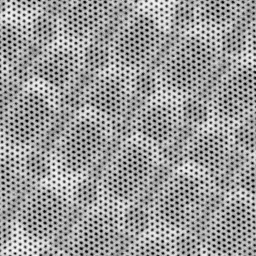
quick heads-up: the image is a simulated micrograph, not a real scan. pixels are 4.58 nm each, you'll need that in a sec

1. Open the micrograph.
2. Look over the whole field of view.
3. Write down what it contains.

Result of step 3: a regular array of holes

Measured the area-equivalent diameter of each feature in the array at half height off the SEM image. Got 10.3 nanometers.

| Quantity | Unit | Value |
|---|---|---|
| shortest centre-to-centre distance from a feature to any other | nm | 25.9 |